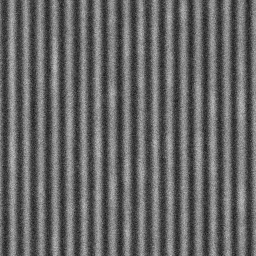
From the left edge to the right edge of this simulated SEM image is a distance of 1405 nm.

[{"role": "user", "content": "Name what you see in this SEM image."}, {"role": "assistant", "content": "parallel lines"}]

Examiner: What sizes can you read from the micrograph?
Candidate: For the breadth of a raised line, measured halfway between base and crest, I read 5.99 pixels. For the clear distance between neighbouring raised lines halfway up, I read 46.6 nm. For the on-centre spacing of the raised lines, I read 0.0786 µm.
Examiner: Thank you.